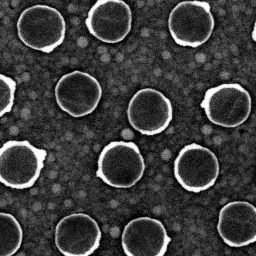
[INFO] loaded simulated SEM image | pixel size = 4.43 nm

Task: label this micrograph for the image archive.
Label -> raised bodies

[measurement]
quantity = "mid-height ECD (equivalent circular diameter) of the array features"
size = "201 nanometers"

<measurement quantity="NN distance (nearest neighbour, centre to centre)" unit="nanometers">312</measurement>